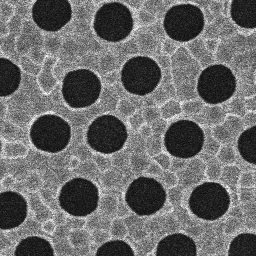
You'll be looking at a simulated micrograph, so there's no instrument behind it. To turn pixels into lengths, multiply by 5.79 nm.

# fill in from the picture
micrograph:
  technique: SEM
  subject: a regular array of holes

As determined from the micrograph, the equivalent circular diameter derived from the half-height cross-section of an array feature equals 226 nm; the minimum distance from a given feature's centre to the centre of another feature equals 369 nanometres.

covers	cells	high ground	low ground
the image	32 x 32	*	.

****.....****..**************...
****.....***....*****....****...
****.....***.....****....****...
*****...****....*****....*****..
************....*****....*******
********************************
********************************
.***************...*************
..*************.....******..****
...*****....***.....*****....***
..******.....**.....*****.....**
..******....****...******....***
********....*************...****
*********.**********************
*****..******.******************
****....***....*******...*******
****.....**.....*****....*****..
****.....**.....****.....*****..
*****...****...******....*****..
**********************..******..
********************************
********************************
*********..******..*************
********....****....****....****
...****.....****.....***.....***
...****.....****....****.....***
...*****....*****..*****....****
...*****************************
..******************************
*********************..*******..
**....*******...****....*****...
**.....*****.....**......****...